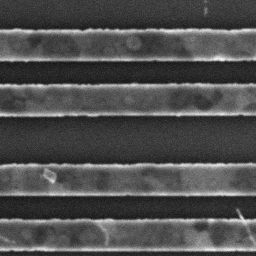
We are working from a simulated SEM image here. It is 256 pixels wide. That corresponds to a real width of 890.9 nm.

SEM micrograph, lines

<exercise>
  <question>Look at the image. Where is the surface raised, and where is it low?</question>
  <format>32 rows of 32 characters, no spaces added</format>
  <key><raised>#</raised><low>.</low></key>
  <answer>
................................
................................
................................
................................
################################
################################
################################
###############################.
................................
................................
................................
################################
################################
################################
................................
................................
................................
................................
................................
................................
................................
################################
################################
################################
................................
................................
................................
###...########...###############
################################
################################
################################
................................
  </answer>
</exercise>